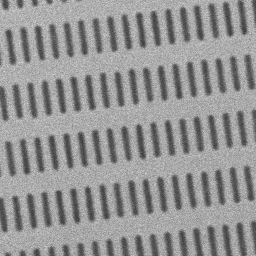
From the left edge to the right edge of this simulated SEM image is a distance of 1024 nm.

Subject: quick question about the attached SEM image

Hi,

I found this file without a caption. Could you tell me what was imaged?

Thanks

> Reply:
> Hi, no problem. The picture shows a regular array of holes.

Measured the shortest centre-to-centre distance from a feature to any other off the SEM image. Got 0.0581 micrometres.